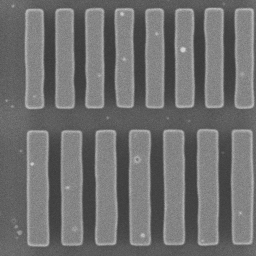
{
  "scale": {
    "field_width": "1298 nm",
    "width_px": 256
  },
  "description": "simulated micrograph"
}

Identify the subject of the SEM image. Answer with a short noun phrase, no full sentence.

groups of lines, slits or small figures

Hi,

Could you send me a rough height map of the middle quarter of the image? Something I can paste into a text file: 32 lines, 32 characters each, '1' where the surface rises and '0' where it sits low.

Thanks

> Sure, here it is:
11000011110001111000011110001111
11000011110001111000011110001111
11000011110001111000011110001111
11000011110001111000011110001111
11000011110001111000011110001111
11000011110001111000011110001111
11000011110001111000011110001111
11000011110001111000011110001111
11000011110001111000011110001111
11000111110001111000011110001111
11000011110000111000011110001111
00000000000000000000000000000000
00000000000000000000000000000000
00000000000000000000000000000000
00000000000000000000000000000000
00000000000000000000000000000000
00000000000000000000000000000000
11110000111110001111100001111100
11110000111110001111100001111100
11110000111110001111100001111100
11110000111110001111100001111100
11110000111110001111100001111100
11110000111110001111100001111100
11110000111110001111100001111100
11110000111110001111100001111100
11110000111110001111100001111100
11111000111110001111100001111100
11111000111110001111100001111100
11111000111110001111100001111100
11111000111110001111100001111100
11111000111110001111100001111100
11110000111110001111100001111100